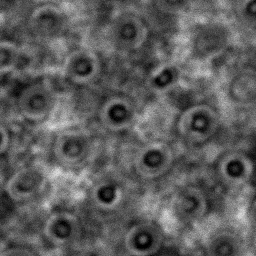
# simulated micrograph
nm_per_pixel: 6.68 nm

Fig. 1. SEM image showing a regular array of ring-shaped raised bodies with a dot in the middle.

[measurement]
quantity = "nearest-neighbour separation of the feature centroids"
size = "378 nanometres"